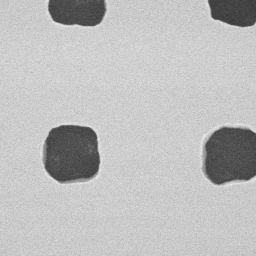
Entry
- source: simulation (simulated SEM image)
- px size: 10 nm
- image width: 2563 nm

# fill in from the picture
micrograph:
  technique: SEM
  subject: holes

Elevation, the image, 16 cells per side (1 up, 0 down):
1110000111111000
1111001111111100
1111111111111111
1111111111111111
1111111111111111
1111111111111111
1111111111111111
1111111111111111
1110001111111000
1110001111111000
1110001111111000
1111111111111011
1111111111111111
1111111111111111
1111111111111111
1111111111111111